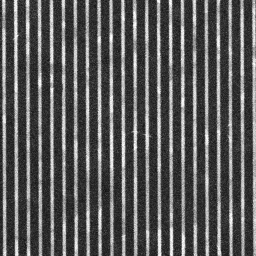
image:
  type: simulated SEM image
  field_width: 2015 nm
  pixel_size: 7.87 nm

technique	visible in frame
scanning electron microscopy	parallel lines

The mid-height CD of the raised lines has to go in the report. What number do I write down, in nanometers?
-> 18.7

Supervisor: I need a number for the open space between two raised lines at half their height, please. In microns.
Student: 0.0738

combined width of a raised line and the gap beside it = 93.7 nm